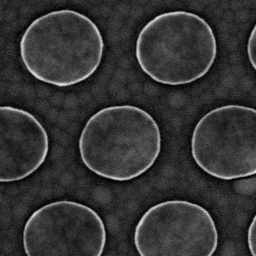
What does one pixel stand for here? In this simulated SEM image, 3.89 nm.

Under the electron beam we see raised bodies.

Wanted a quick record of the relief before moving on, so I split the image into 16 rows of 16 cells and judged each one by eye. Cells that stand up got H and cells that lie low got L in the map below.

LLLLLLLLLLLLLLLL
LLHHHHLLLHHHHLLL
LHHHHHLLLHHHHLLL
LHHHHHLLLHHHHLLL
LLHHHHLLLHHHHLLL
LLLLLLLLLLLLLLLL
LLLLLLLLLLLLLLLL
HHLLLLHHHHLLLHHH
HHHLLHHHHHLLHHHH
HHHLLHHHHHLLHHHH
HHLLLLHHHLLLLHHH
LLLLLLLLLLLLLLLL
LLLLLLLLLLLLLLLL
LLHHHHLLLHHHHLLL
LLHHHHLLLHHHHLLL
LLHHHHLLLHHHHLLL